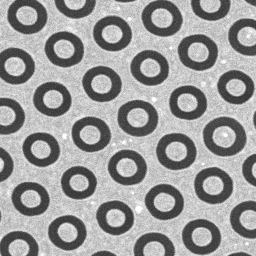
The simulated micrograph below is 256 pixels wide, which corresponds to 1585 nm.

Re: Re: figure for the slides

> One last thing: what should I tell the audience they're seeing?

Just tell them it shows a regular array of ring-shaped grooves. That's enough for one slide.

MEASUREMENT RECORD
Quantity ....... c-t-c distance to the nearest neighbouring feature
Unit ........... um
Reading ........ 0.31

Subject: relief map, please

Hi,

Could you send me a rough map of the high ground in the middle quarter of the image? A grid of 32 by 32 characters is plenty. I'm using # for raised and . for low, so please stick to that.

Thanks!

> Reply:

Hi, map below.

..######..#######..#####..####..
######......####...#####..######
#####........####...####..######
#####...###...####........######
####...#####...####......#######
#####..#####...##############...
.####...###...#############.....
..####........#############...#.
..#####......#############...###
..#######.######.....#####..####
..############........####...###
.#############...###...####..###
#############...#####...###.....
####.....####...#####...#####...
###.......###...#####..#########
##....#....###...###...#########
##..#####..####........#########
##..#####...####.....#####....##
##..#####...############.......#
##...###...#############........
###........############...####..
####.....######..######..######.
#############......####...#####.
############........###...####..
###########...####..####........
###.#######..#####...####.......
#.....#####..#####...######..###
........###...####...###########
..###...####........############
..####..#####......#############
..####..########.#####.....#####
...##...#############........###